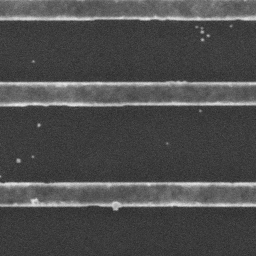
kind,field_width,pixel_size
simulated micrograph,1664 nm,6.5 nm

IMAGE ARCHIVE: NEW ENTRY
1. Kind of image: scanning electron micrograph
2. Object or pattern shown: lines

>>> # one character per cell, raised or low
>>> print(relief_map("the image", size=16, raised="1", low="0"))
1111111111111111
0000000000000000
0000000000000000
0000000000000000
0000000000000000
1111111111111111
1111111111111111
0000000000000000
0000000000000000
0000000000000000
0000000000000000
0111111111111111
1111111111111111
0000000000000000
0000000000000000
0000000000000000